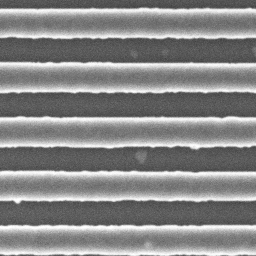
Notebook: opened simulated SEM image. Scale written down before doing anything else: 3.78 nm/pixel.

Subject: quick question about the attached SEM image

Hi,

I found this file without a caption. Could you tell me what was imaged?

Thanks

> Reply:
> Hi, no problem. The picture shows lines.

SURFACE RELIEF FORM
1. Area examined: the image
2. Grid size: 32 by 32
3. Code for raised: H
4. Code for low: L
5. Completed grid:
LLLLLLLLLLLLLLLLLLLLLLLLLLLLLLLL
HHHHHHHHHHHHHHHHHHHHHHHHHHHHHHHH
HHHHHHHHHHHHHHHHHHHHHHHHHHHHHHHH
HHHHHHHHHHHHHHHHHHHHHHHHHHHHHHHH
HHHHHHHHHHHHHHHHHHHHHHHHHHHHHHHH
LLLLLLLLLLLLLLLLLLLLLLLLLLLLLLLL
LLLLLLLLLLLLLLLLLLLLLLLLLLLLLLLL
LLLLLLLLLLLLLLLLLLLLLLLLLLLLLLLL
HHHHHHHHHHHHHHHHHHHHHHHHHHHHHHHH
HHHHHHHHHHHHHHHHHHHHHHHHHHHHHHHH
HHHHHHHHHHHHHHHHHHHHHHHHHHHHHHHH
HHHLLLLLHHLHHHHHHHHHHLLLLHLLLLLH
LLLLLLLLLLLLLLLLLLLLLLLLLLLLLLLL
LLLLLLLLLLLLLLLLLLLLLLLLLLLLLLLL
LLLLLLLLLLLLLLLLLLLLLLLLLLLLLLLL
HHHHHHHHHHHHHHHHHHHHHHHHHHHHHHHH
HHHHHHHHHHHHHHHHHHHHHHHHHHHHHHHH
HHHHHHHHHHHHHHHHHHHHHHHHHHHHHHHH
LLLLLLLLLLLLLLLLLLLLLLLLLLLLLLLL
LLLLLLLLLLLLLLLLLLLLLLLLLLLLLLLL
LLLLLLLLLLLLLLLLLLLLLLLLLLLLLLLL
HHHLHHHLLLLLLLHLLLLLLLLLLLLLLLLL
HHHHHHHHHHHHHHHHHHHHHHHHHHHHHHHH
HHHHHHHHHHHHHHHHHHHHHHHHHHHHHHHH
HHHHHHHHHHHHHHHHHHHHHHHHHHHHHHHH
LLLLLLLLLLLLLLLLLLLLLLLLLLLLLLLL
LLLLLLLLLLLLLLLLLLLLLLLLLLLLLLLL
LLLLLLLLLLLLLLLLLLLLLLLLLLLLLLLL
HHHHHHHHHHHHHHHHHHHHHHHHHHHHHHHH
HHHHHHHHHHHHHHHHHHHHHHHHHHHHHHHH
HHHHHHHHHHHHHHHHHHHHHHHHHHHHHHHH
HHHHHHHHHHHHHHHHHHHHHHHHHHHHHHHH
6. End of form